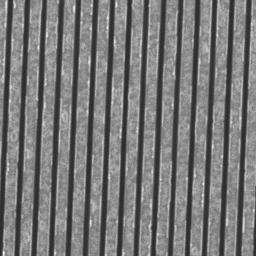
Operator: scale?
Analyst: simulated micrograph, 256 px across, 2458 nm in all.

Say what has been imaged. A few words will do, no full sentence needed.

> parallel lines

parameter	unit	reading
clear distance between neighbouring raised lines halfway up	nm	50.4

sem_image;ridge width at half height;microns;0.109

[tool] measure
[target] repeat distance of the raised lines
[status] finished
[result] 164 nm